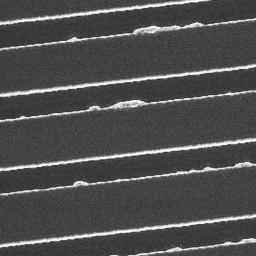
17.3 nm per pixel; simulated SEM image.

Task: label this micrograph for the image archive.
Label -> lines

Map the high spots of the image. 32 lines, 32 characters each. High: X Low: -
XXXXXXXXXXXXXXXXXXXXX-----------
XXXXXXXXXXXXX-------------------
XXX---------------------------XX
------------------XX-XXXXXXXXXXX
--------------XXXXXXXXXXXXXXXXXX
-----XXXXXXXXXXXXXXXXXXXXXXXXXXX
XXXXXXXXXXXXXXXXXXXXXXXXXXXXXXXX
XXXXXXXXXXXXXXXXXXXXXXXXXXXXXXXX
XXXXXXXXXXXXXXXXXXXXXXXXXXXXXXX-
XXXXXXXXXXXXXXXXXXXXX-----------
XXXXXXXXXXXXX-------------------
XXXX---------------------------X
----------------------XXXXXXXXXX
-----------X--XXXXXXXXXXXXXXXXXX
-----XXXXXXXXXXXXXXXXXXXXXXXXXXX
XXXXXXXXXXXXXXXXXXXXXXXXXXXXXXXX
XXXXXXXXXXXXXXXXXXXXXXXXXXXXXXXX
XXXXXXXXXXXXXXXXXXXXXXXXXXXXXXXX
XXXXXXXXXXXXXXXXXXXXXXXX--------
XXXXXXXXXXXXXXX-----------------
XXXXXXX-----------------------X-
------------------------XXXXXXXX
---------------XXXXXXXXXXXXXXXXX
-------XXXXXXXXXXXXXXXXXXXXXXXXX
XXXXXXXXXXXXXXXXXXXXXXXXXXXXXXXX
XXXXXXXXXXXXXXXXXXXXXXXXXXXXXXXX
XXXXXXXXXXXXXXXXXXXXXXXXXXXXXXXX
XXXXXXXXXXXXXXXXXXXXXXXXXXXX----
XXXXXXXXXXXXXXXXXXXX------------
XXXXXXXXXXX---------------------
XX---------------------------XXX
--------------------XXXXXXXXXXXX